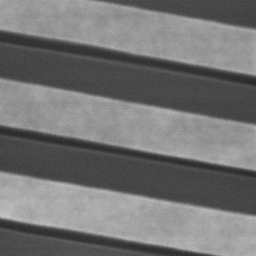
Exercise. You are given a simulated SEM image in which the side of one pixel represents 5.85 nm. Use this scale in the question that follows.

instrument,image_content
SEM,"lines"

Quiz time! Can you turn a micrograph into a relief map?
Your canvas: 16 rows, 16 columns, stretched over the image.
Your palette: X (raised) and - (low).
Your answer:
XXXXXXXXX-------
XXXXXXXXXXXXXX--
----XXXXXXXXXXXX
---------XXXXXXX
---------------X
XXX-------------
XXXXXXXXX-------
XXXXXXXXXXXXXX--
----XXXXXXXXXXXX
---------XXXXXXX
---------------X
XXXX------------
XXXXXXXXXX------
XXXXXXXXXXXXXXXX
-----XXXXXXXXXXX
-----------XXXXX